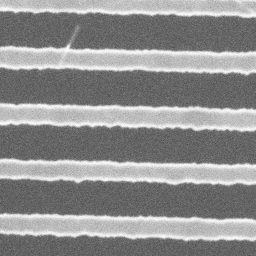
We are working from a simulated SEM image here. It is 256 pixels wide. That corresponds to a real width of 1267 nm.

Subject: lines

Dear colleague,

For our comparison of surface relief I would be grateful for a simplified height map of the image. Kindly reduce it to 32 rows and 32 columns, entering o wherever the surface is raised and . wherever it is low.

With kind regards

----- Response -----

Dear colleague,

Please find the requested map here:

oooooooooooooooooooooooooooooooo
....o..o.ooooooooooooooooooooooo
................................
................................
................................
................................
oooooooooooooooooooooo..........
oooooooooooooooooooooooooooooooo
.ooooo.o.ooooooooooooooooooooooo
................................
................................
................................
................................
ooooooooooooooooooo.o...o.......
oooooooooooooooooooooooooooooooo
o...o.oooooooooooooooooooooooooo
................................
................................
................................
................................
ooooooooooooooooo.o.............
oooooooooooooooooooooooooooooooo
......o..o...ooooooooooooooooooo
................................
................................
................................
................................
ooooooooooooooooooooooooooo.ooo.
oooooooooooooooooooooooooooooooo
.............ooooooooooooooooooo
................................
................................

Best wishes